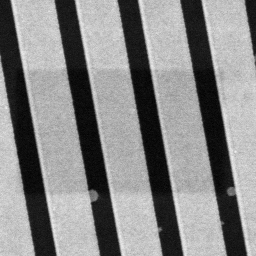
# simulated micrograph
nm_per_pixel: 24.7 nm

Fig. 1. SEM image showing lines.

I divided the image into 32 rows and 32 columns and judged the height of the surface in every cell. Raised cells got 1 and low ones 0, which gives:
01111110011111100111111001111110
00111110001111100011111001111110
00111110001111100011111000111110
00111110001111100011111000111110
00111111001111100011111000111110
00111111001111110011111000111110
00111111000111110011111100111111
00011111000111110001111100011111
00011111000111110001111100011111
00011111000111110001111100011111
10011111100111111001111100011111
10011111100111111001111110011111
10001111100011111000111110011111
10001111100011111000111110001111
10001111100011111000111110001111
10001111110011111000111110001111
11001111110011111100111110001111
11000111110001111100111111001111
11000111110001111100011111000111
11000111110001111100011111000111
11000111110001111100011111000111
11100111111001111100011111000111
11100111111001111110011111100111
11100011111000111110011111100111
11100011111000111110001111100011
11100011111000111110001111100011
11100011111000111110001111100011
11110011111100111111001111110011
11110001111100011111001111110011
11110001111100011111001111110011
11110001111100011111000111110001
11110001111100011111000111110001